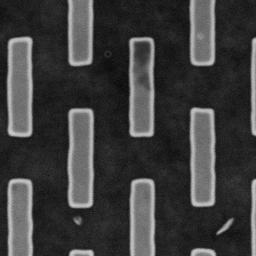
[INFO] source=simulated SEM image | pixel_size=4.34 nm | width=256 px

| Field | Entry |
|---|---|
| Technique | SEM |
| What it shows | groups of lines, slits or small figures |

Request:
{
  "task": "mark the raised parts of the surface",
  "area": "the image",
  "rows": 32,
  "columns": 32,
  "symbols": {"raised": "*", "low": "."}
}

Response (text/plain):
.........**.............***.....
.........**.............***.....
.........**.............***.....
.........**.............***.....
.........**.............***.....
.***.....**.....***.....***.....
.***.....**.....***.....***.....
.***.....**.....***.....***.....
.***............***.............
.***............***.............
.***............***.............
.***............***.............
.***............***.............
.***............***.............
.***.....***....***.....***.....
.***.....***....***.....***.....
.***.....***....***.....***.....
.........***............***.....
.........***............***.....
.........***............***.....
.........**.............***.....
.........***............***.....
.........***............***.....
.***.....**......**.....***.....
.***.....**.....***.....***.....
.***.....**.....***.....**......
.***............***.............
.***............***.............
.***............***.............
.***............***.............
.***............***.............
.***.....**.....***.....***.....